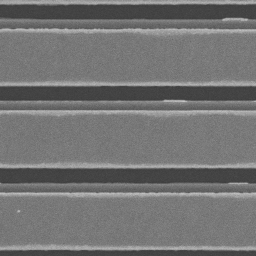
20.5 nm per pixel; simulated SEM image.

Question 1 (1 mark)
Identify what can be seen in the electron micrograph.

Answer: lines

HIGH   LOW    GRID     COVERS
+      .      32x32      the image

+++++++++++++++++++++++..+.+.++.
................................
...........................++++.
++++++++++++++++++++++++++++++++
++++++++++++++++++++++++++++++++
++++++++++++++++++++++++++++++++
++++++++++++++++++++++++++++++++
++++++++++++++++++++++++++++++++
++++++++++++++++++++++++++++++++
++++++++++++++++++++++++++++++++
++++++++++++++++++++++++++++++++
................................
................................
++++++++++++++++++++++++++++++++
++++++++++++++++++++++++++++++++
++++++++++++++++++++++++++++++++
++++++++++++++++++++++++++++++++
++++++++++++++++++++++++++++++++
++++++++++++++++++++++++++++++++
++++++++++++++++++++++++++++++++
++++++++++++++++++++++++++++++++
................................
................................
++++++++++++++++++++++++++++++++
++++++++++++++++++++++++++++++++
++++++++++++++++++++++++++++++++
++++++++++++++++++++++++++++++++
++++++++++++++++++++++++++++++++
++++++++++++++++++++++++++++++++
++++++++++++++++++++++++++++++++
++++++++++++++++++++++++++++++++
................................